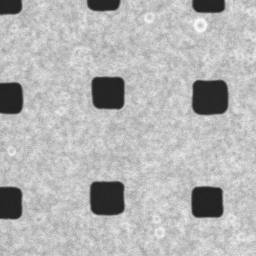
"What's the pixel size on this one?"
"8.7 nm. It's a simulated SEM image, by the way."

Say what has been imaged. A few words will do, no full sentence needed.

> holes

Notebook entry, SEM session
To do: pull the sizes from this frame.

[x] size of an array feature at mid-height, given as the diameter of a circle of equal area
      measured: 322 nm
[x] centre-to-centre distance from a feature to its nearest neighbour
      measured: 880 nm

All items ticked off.